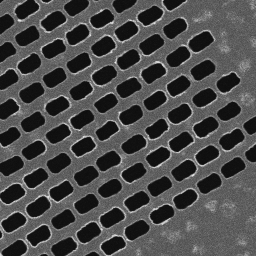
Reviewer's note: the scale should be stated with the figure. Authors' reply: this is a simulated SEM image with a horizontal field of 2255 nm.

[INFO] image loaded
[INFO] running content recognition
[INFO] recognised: a regular array of holes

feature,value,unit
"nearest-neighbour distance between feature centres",244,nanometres